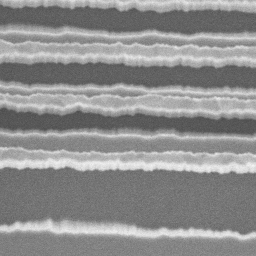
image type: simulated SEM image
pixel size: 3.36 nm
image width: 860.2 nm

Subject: lines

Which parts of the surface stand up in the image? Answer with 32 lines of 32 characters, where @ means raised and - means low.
--------------@@-@@@@@@@@@@@@@@@
--------------------------------
--------------------------------
--------------------------------
@@@@@@@@@@@@@@@@@@@@@@@-@@@-----
@@@@@@@@@@@@@@@@@@@@@@@@@@@@@@@@
@@@@@@@@@@@@@@@@@@@@@@@@@@@@@@@@
----------------@@@@@@@@@@@@@@@@
--------------------------------
--------------------------------
--------------------------------
@@@@@@@@@@@@@@@@@@@@@@@@@-@@@@-@
@@@@@@@@@@@@@@@@@@@@@@@@@@@@@@@@
--@-@@@@@-@@@@@@@@@@@@@@@@@@@@@@
--------------------------------
--------------------------------
--------------------------------
@@@@@@@@@@@@@@@@@@@@@@@@@@@@@@@@
@@@@@@@@@@@@@@@@@@@@@@@@@@@@@@@@
@@@@@@@@@@@@@@@@@@@@@@@@@@@@@@@@
--@-@@-@-@@@@@@@@@@@@@@@@@@@@@@@
--------------------------------
--------------------------------
--------------------------------
--------------------------------
--------------------------------
--------------------------------
--------------------------------
--@@-@--------------------------
@@@@@@@@@@@@@@@@@@@@@@@@@@@@@@-@
@@@@@@@@@@@@@@@@@@@@@@@@@@@@@@@@
@@@@@@@@@@@@@@@@@@@@@@@@@@@@@@@@